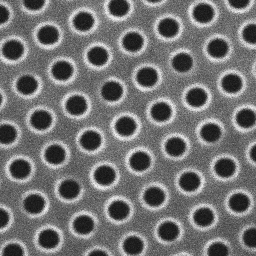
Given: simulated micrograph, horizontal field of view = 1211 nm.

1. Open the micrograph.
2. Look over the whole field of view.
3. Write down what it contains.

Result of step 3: a regular array of holes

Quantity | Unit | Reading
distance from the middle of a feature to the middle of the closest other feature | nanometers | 178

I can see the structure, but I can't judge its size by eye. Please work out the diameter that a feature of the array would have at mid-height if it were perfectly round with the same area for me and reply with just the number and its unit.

96.6 nanometres